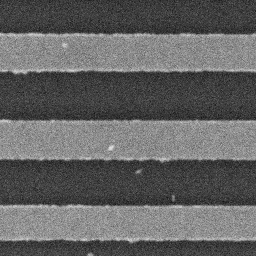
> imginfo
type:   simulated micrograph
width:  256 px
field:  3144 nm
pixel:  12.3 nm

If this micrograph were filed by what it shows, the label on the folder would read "lines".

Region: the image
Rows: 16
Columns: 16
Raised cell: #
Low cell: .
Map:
................
................
################
################
................
................
................
................
################
################
................
................
................
################
################
................